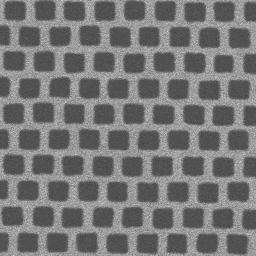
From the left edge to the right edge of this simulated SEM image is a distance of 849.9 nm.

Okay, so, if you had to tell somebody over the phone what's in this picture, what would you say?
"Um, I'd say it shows a regular array of holes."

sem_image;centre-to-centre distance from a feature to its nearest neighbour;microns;0.0966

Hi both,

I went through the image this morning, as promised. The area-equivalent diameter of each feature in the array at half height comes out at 0.0741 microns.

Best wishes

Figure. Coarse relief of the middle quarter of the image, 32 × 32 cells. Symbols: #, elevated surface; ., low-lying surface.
.....##......##.....##......##..
.....###....###.....###.....##..
################################
.###############################
..##.....##.....##......##.....#
..##.....##.....##......##.....#
..##.....##.....##......##.....#
..##.....##.....###.....##.....#
.####...####....###....###.....#
################################
.....###....###.....###....###..
.....##......##.....##......##..
.....###.....##.....##......##..
.....###.....##.....##......##..
.....###.....##.....##......##..
################################
####....####...############.#.##
.###.....##.....###.....##.....#
.###.....##.....###.....##.....#
.###.....##.....##......##.....#
.###.....##.....##......##.....#
#############..####....####...##
################################
.....##.....###....###.....###..
.....##.....##......##.....##...
.....##.....##......##.....##...
.....##.....##......##.....###..
....###.....###.....##.....###..
################################
####....###....############...##
.##......##.....##......##.....#
.##......##.....##......##.....#